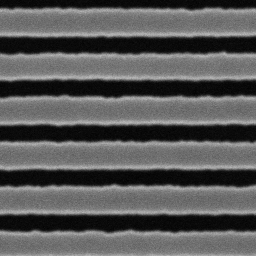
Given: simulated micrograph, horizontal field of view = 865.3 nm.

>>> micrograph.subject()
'lines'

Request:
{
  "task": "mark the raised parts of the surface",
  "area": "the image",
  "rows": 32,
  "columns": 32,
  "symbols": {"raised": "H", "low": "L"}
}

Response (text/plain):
LLLLLLLLLLLLLLLLLLLLLLLLLLLLLLLL
HHHHHHHHHHHHHHHHHHHHHHHHHHHHHHHH
HHHHHHHHHHHHHHHHHHHHHHHHHHHHHHHH
HHHHHHHHHHHHHHHHHHHHHHHHHHHHHHHH
LLHHHHHHHHHHLHLHHLHHHHLHHLLHLLLL
LLLLLLLLLLLLLLLLLLLLLLLLLLLLLLLL
LLLLLLLLLLLLLLLLLLLLLLLLLLLLLLLL
HHHHHHHHHHHHHHHHHHHHHHHHHHHHHHHH
HHHHHHHHHHHHHHHHHHHHHHHHHHHHHHHH
HHHHHHHHHHHHHHHHHHHHHHHHHHHHHHHH
LLLLLLLLLLLLLLLLLLLLLLLLLLLLLLLL
LLLLLLLLLLLLLLLLLLLLLLLLLLLLLLLL
HHHHHHHHHHHHHHHHHHHHHHHHHHHHHHHH
HHHHHHHHHHHHHHHHHHHHHHHHHHHHHHHH
HHHHHHHHHHHHHHHHHHHHHHHHHHHHHHHH
HHHHHLHHHHLHHHHHHHHLHLHHHHHHHLHL
LLLLLLLLLLLLLLLLLLLLLLLLLLLLLLLL
LLLLLLLLLLLLLLLLLLLLLLLLLLLLLLLL
HHHHHHHHHHHHHHHHHHHHHHHHHHHHHHHH
HHHHHHHHHHHHHHHHHHHHHHHHHHHHHHHH
HHHHHHHHHHHHHHHHHHHHHHHHHHHHHHHH
LLLLLLLLLLLLLLLLLLLLLLLLLLLLLLLL
LLLLLLLLLLLLLLLLLLLLLLLLLLLLLLLL
HHHHHHHHHHHHHHHHHHHHHHHHHHHHHHHH
HHHHHHHHHHHHHHHHHHHHHHHHHHHHHHHH
HHHHHHHHHHHHHHHHHHHHHHHHHHHHHHHH
HHHHHHHHHHHHHHHHHHHHHHHHHHHHHHHH
LLLLLLLLLLLLLLLLLLLLLLLLLLLLLLLL
LLLLLLLLLLLLLLLLLLLLLLLLLLLLLLLL
HHHHHHHHHHHHHHHHHHHHHHHHHHHHHHHH
HHHHHHHHHHHHHHHHHHHHHHHHHHHHHHHH
HHHHHHHHHHHHHHHHHHHHHHHHHHHHHHHH